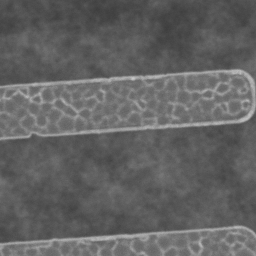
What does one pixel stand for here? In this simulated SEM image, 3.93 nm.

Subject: one or a few lines or trenches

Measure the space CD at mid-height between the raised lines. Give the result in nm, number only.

411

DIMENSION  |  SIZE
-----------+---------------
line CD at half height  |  204 nm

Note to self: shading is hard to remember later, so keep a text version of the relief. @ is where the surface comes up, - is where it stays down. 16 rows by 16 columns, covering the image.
----------------
----------------
----------------
----------------
-------------@@-
@@@@@@@@@@@@@@@@
@@@@@@@@@@@@@@@@
@@@@@@@@@@@@@@@-
@@--------------
----------------
----------------
----------------
----------------
----------------
-----------@@@@@
@@@@@@@@@@@@@@@@